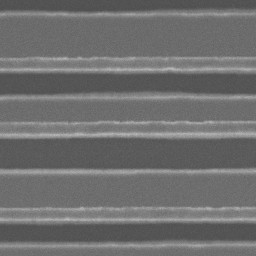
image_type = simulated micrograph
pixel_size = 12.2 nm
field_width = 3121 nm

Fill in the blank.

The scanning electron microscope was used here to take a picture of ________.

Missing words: lines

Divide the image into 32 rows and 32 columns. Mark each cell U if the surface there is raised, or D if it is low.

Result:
DDDDDDDDDDDDDDDDDDDDDDDDDDDDDDDD
DDDDDDDDDDDDDDDDDDDDDDDDDDDDDDDD
UUUUUUUUUUUUUUUUUUUUUUUUUUUUUUUU
UUUUUUUUUUUUUUUUUUUUUUUUUUUUUUUU
UUUUUUUUUUUUUUUUUUUUUUUUUUUUUUUU
UUUUUUUUUUUUUUUUUUUUUUUUUUUUUUUU
UUUUUUUUUUUUUUUUUUUUUUUUUUUUUUUU
UUUUUUUUUUUUUUUUUUUUUUUUUUUUUUUU
UUUUUUUUUUUUUUUUUUUUUUUUUUUUUUUU
DDDDDDDDDDDDDDDDDDDDDDDDDDDDDDDD
DDDDDDDDDDDDDDDDDDDDDDDDDDDDDDDD
DDDDDDDDDDDDDDDDDDDDDDDDDDDDDDDD
UUUUUUUUUUUUUUUUUUUUUUUUUUUUUUUU
UUUUUUUUUUUUUUUUUUUUUUUUUUUUUUUU
UUUUUUUUUUUUUUUUUUUUUUUUUUUUUUUU
UUUUUUUUUUUUUUUUUUUUUUUUUUUUUUUU
UUUUUUUUUUUUUUUUUUUUUUUUUUUUUUUU
DDDDDDDDDDDDDDDDDDDDDDDDDDDDDDDD
DDDDDDDDDDDDDDDDDDDDDDDDDDDDDDDD
DDDDDDDDDDDDDDDDDDDDDDDDDDDDDDDD
DDDDDDDDDDDDDDDDDDDDDDDDDDDDDDDD
UUUUUUUUUUUUDUUUUUUUUUUUUUUUUUUU
UUUUUUUUUUUUUUUUUUUUUUUUUUUUUUUU
UUUUUUUUUUUUUUUUUUUUUUUUUUUUUUUU
UUUUUUUUUUUUUUUUUUUUUUUUUUUUUUUU
UUUUUUUUUUUUUUUUUUUUUUUUUUUUUUUU
UUUUUUUUUUUUUUUUUUUUUUUUUUUUUUUU
UUUUUUUUDUUUUUUUUUUUDDDDDDDDUDDD
DDDDDDDDDDDDDDDDDDDDDDDDDDDDDDDD
DDDDDDDDDDDDDDDDDDDDDDDDDDDDDDDD
DDDDDDDDDDDDDDDDDDDDDDDDDDDUUUUU
UUUUUUUUUUUUUUUUUUUUUUUUUUUUUUUU